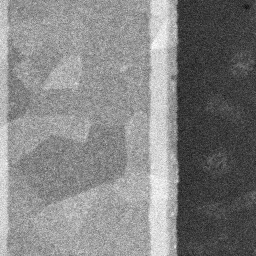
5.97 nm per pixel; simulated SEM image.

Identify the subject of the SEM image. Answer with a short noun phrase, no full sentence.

one or a few lines or trenches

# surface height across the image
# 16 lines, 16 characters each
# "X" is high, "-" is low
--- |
XXXXXXXXXX------
XXXXXXXXXX------
XXXXXXXXXX------
XXXXXXXXXX------
XXXXXXXXXX------
XXXXXXXXXX------
XXXXXXXXXX------
XXXXXXXXXX------
XXXXXXXXXX------
XXXXXXXXXX------
XXXXXXXXXX------
XXXXXXXXXX------
XXXXXXXXXX------
XXXXXXXXXX------
XXXXXXXXXX------
XXXXXXXXXX------